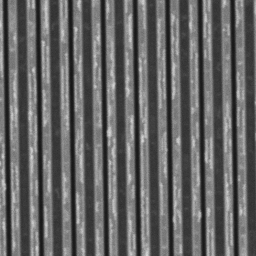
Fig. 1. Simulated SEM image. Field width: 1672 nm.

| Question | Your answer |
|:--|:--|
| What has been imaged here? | parallel lines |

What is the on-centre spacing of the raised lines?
106 nm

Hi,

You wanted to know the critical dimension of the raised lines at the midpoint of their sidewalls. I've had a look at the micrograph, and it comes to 59.6 nm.